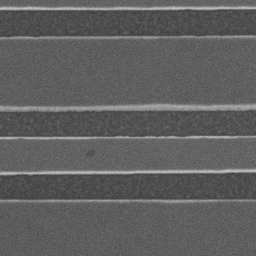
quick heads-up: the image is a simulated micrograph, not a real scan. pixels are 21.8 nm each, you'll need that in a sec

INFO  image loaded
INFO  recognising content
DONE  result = lines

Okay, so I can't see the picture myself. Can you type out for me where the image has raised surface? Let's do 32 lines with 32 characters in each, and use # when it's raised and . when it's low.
################################
................................
................................
................................
................................
################################
################################
################################
################################
################################
################################
################################
################################
##################.......##.....
................................
................................
................................
################################
################################
################################
################################
########################...#....
................................
................................
................................
################################
################################
################################
################################
################################
################################
################################